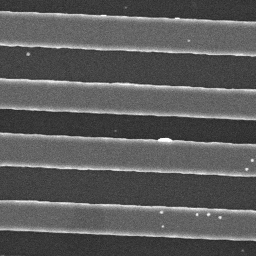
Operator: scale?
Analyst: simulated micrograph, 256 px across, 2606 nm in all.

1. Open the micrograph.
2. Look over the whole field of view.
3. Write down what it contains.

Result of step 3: lines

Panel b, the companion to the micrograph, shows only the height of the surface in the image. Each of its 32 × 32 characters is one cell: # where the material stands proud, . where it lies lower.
................................
##..............................
########################........
################################
################################
################################
.....................###########
................................
................................
................................
#############...................
################################
################################
################################
.......................#########
................................
................................
######################..........
################################
################################
################################
....................############
................................
................................
................................
###########.....................
################################
################################
################################
...................#############
................................
................................